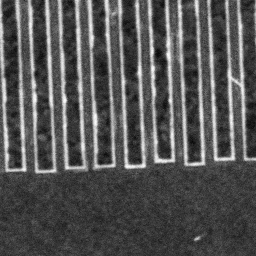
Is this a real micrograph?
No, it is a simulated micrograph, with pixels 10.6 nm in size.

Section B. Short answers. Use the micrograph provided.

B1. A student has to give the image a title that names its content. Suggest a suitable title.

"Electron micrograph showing parallel lines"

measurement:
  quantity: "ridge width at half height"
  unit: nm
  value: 199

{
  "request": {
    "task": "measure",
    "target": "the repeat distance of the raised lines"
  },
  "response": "0.317 um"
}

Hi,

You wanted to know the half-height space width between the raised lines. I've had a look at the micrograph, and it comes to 115 nanometres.